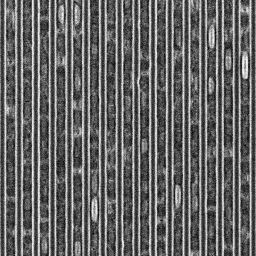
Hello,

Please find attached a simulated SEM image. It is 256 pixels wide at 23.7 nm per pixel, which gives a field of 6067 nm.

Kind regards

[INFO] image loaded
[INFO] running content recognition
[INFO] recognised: parallel lines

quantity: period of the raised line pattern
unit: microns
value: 0.396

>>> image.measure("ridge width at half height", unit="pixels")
6.87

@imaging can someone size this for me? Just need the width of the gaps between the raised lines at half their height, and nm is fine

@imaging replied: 234